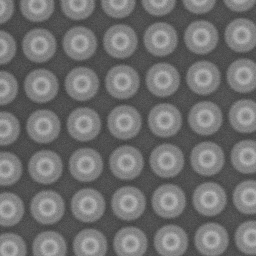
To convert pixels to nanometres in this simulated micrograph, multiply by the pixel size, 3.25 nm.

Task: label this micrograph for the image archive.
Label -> an array of small figures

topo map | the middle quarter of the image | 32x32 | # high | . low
.............###......#####.....
..#####.....######...#######...#
.#######...#######...########..#
.#######..#########..########..#
#########.#########..########..#
#########..########..########..#
.#######...#######...#######....
.#######....#####......####.....
..#####......###................
................................
..............##.......####.....
...####.....######....#######...
..######...########..########..#
.########..########..########..#
.########..########..########..#
.########..########..########...
.########..########...#######...
.#######....######.....#####....
..#####.......###...............
................................
........................####....
....###......#####.....######...
..#######...#######...########..
..#######...########..########..
.#########.#########..########..
.#########.#########..########..
.#########..#######...#######...
..#######...#######....#####....
...#####......###...............
................................
.........................###....
....####......#####....######...